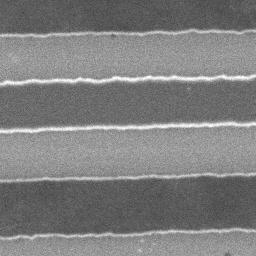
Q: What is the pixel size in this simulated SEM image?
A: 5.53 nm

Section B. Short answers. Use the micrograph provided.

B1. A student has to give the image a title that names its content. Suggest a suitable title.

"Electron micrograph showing lines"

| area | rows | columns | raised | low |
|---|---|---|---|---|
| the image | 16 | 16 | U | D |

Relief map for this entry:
UUUUUUUUUUUUUUUU
UUUUUUUUUUUUUUUU
DDDDDDDDDDDDDDDD
DDDDDDDDDDDDDDDD
DDDDDDDDDDDDDDDD
UUUUUUUUUUUUUUUU
UUUUUUUUUUUUUUUU
UUUUUUUUUUUUUUUU
DDDDDDDDDDDDDDDD
DDDDDDDDDDDDDDDD
DDDDDDDDDDDDDDDD
UUUUUUUUUUUUUUUU
UUUUUUUUUUUUUUUU
UUUUUUUUUUUUUUUU
UUUUUUUUUUUUUDDD
DDDDDDDDDDDDDDDD